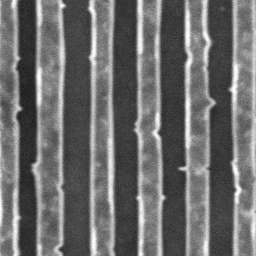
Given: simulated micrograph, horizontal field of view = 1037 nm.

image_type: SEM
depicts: parallel lines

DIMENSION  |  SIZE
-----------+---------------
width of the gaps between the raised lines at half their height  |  105 nanometers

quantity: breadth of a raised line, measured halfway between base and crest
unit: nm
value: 89.5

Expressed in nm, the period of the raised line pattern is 198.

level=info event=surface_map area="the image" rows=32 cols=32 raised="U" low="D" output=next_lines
UUDDDUUUDDDUUUDDDUUUDDDUUUDDDUUU
UUDDDUUUDDDUUUDDDUUUDDDUUUDDDUUU
UUDDDUUUDDDDUUDDDUUUDDDUUUDDDUUU
UUDDDUUUDDDDUUDDDUUUDDDUUUDDDUUU
UUDDDUUUDDDDUUDDDUUUDDDUUUDDDUUU
UUDDDUUUDDDDUUDDDUUUDDDUUUDDDUUU
UUDDDUUUDDDUUUDDDUUUDDDUUUDDDUUU
UUDDDUUUDDDUUUDDDUUUDDDUUUDDDUUU
UUDDDUUUDDDDUUDDDUUUDDDUUUDDDUUU
UUDDDUUUDDDDUUDDDUUUDDDUUUDDDUUU
UUDDDUUUDDDDUUDDDUUUDDDUUUDDDUUU
UUDDDUUUDDDDUUDDDUUUDDDUUUDDDUUU
UUDDDUUUDDDDUUDDDUUUDDDUUUUDDUUU
UUDDDUUUDDDDUUDDDUUUDDDUUUDDDUUU
UUDDDUUUDDDDUUDDDUUUDDDUUUDDDUUU
UUDDDUUUDDDUUUDDDUUUDDDUUUDDDUUU
UUDDDUUUDDDUUUDDDUUUDDDUUUDDDUUU
UUDDDUUUDDDUUUDDDUUUDDDUUUDDDUUU
UUDDDUUUDDDUUUDDDDUUDDDUUUDDDUUU
UUDDDUUUDDDDUUDDDDUUDDDUUUDDDUUU
UUDDUUUUDDDDUUDDDUUUDDDUUUDDDUUU
UUDDUUUUDDDUUUDDDUUUDDDUUUDDDUUU
UUDDDUUUDDDUUUDDDDUUDDDUUUDDDUUU
UUDDDUUUDDDUUUDDDDUUDDDUUUDDDUUU
UUDDDUUUDDDDUUDDDUUUDDDUUUDDDUUU
UUDDDUUUDDDDUUDDDDUUDDDUUUDDDUUU
UUDDDUUUDDDDUUDDDDUUDDDUUUDDDUUU
UUDDDUUUDDDDUUDDDDUUDDDUUUDDDUUU
UUDDDUUUDDDUUUDDDUUUDDDUUUDDDUUU
UUDDDUUUDDDDUUDDDUUUDDDUUUDDDUUU
UUDDDUUUDDDDUUDDDUUUDDDUUUDDDUUU
UUDDDUUUDDDDUUDDDUUUDDDUUUDDDUUU